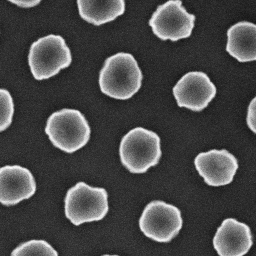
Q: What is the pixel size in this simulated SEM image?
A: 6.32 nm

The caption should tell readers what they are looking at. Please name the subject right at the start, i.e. a regular array of raised bodies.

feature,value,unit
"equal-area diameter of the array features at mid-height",40.5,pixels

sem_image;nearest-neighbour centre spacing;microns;0.472